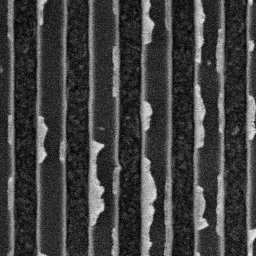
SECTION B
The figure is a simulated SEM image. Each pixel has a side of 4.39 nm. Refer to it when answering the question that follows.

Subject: parallel lines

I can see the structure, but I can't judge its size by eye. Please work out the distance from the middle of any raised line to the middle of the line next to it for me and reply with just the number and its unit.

230 nanometers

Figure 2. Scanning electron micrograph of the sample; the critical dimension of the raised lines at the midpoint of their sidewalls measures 124 nm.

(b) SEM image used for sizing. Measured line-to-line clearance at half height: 109 nm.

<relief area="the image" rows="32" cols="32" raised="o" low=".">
oo...ooo...oooo...ooo...oooo...o
o....ooo...oooo...ooo....ooo...o
o....ooo...oooo...ooo...oooo...o
oo...ooo...oooo...ooo....ooo...o
oo...ooo...oooo...ooo....ooo...o
oo...ooo...oooo...ooo....ooo...o
oo...ooo...oooo...ooo....ooo...o
oo...ooo...oooo...ooo....ooo...o
oo...ooo...oooo...ooo....ooo...o
oo...ooo...oooo...ooo...oooo...o
oo...ooo...oooo...ooo...oooo...o
oo...ooo...oooo...ooo...oooo...o
oo...ooo...oooo...ooo....ooo...o
oo...ooo...oooo...ooo....ooo...o
oo...ooo...oooo...ooo....ooo...o
oo...ooo...oooo...ooo....ooo...o
oo...ooo...oooo...ooo....ooo...o
oo...ooo...oooo...ooo....ooo...o
oo...ooo...oooo...ooo...oooo...o
oo...ooo...oooo...ooo...oooo...o
oo...ooo...oooo...ooo...oooo...o
oo...ooo...oooo...ooo...oooo...o
oo...ooo...oooo...ooo...oooo...o
oo...ooo...oooo...ooo...oooo...o
o....ooo...oooo...ooo...oooo...o
o....ooo...oooo...ooo...oooo...o
o....ooo...oooo...ooo...oooo...o
o....ooo...oooo...ooo...oooo...o
oo...ooo...oooo...ooo....ooo...o
o....ooo...oooo...ooo....ooo...o
oo...ooo...oooo...ooo....ooo...o
oo...ooo...oooo...ooo...oooo...o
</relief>